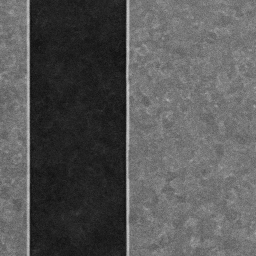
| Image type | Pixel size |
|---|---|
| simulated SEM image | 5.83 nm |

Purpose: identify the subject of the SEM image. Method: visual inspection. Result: one or a few lines or trenches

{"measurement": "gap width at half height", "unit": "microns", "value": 0.584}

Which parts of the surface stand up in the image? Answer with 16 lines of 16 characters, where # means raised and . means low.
##......########
##......########
##......########
##......########
##......########
##......########
##......########
##......########
##......########
##......########
##......########
##......########
##......########
##......########
##......########
##......########